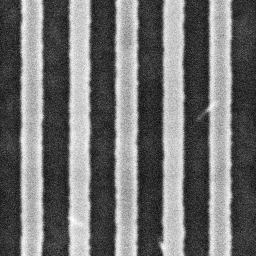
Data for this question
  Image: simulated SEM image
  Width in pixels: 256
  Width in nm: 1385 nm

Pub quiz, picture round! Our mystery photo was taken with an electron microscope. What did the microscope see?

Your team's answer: lines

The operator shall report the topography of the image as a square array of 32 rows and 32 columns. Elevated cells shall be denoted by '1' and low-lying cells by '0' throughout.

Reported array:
00011000011000011000011000111000
00011000011000011000011000111000
00011000011000011000011000111000
00011000011000011000011000111000
00011000011000011000011000111000
00011000011000011000011000111000
00011000011000011000011000111000
00011000011000011000011000111000
00011000011000011000011000111000
00011000011000011000011000111000
00011000011000011000011000111000
00011000011000011000011000111000
00011000011000011000011000111000
00011000011000011000011000111000
00011000011000011000011000111000
00011000011000011000011000111000
00011000011000011000011000111000
00011000011000011000011000111000
00011000011000011000011000111000
00011000011000011000011000111000
00011000011000011000011000111000
00011000011000011000011000111000
00011000011000011000011000111000
00011000011000011000011000111000
00011000011000011000011000111000
00011000011000011000011000111000
00011000011000011000011000111000
00011000011000011000111000111000
00011000011000011000011000111000
00011000011000011000011000111000
00011000011000011000111000111000
00011000011000011000111000111000